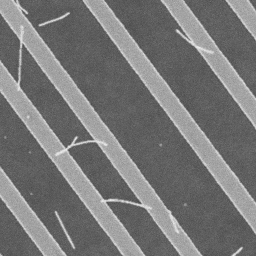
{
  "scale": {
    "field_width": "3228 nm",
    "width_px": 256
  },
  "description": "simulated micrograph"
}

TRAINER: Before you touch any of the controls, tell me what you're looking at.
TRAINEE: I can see lines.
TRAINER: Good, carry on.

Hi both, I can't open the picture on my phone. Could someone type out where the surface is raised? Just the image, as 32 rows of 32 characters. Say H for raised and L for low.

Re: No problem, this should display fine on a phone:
HHLLLLLLLLLHHLLLLLLLLHHLLLLLLHHL
HHHLLLLLLLLHHHLLLLLLLHHHLLLLLHHH
LHHLLLLLLLLLHHHLLLLLLLHHHLLLLLHH
LHHHLLLLLLLLLHHHLLLLLLLHHLLLLLLH
LLHHHLLLLLLLLLHHLLLLLLLHHHLLLLLL
LLLHHHLLLLLLLLHHHLLLLLLLHHHLLLLL
LLLLHHLLLLLLLLLHHHLLLLLLLHHHLLLL
LLLLHHHLLLLLLLLLHHHLLLLLLLHHLLLL
HLLLLHHHLLLLLLLLLHHLLLLLLLHHHLLL
HLLLLLHHHLLLLLLLLHHHLLLLLLLHHHLL
HHLLLLLHHLLLLLLLLLHHHLLLLLLLHHHL
HHHLLLLHHHLLLLLLLLLHHHLLLLLLLHHL
LHHHLLLLHHHLLLLLLLLLHHLLLLLLLHHH
LLHHLLLLLHHHLLLLLLLLHHHLLLLLLLHH
LLHHHLLLLLHHLLLLLLLLLHHHLLLLLLLH
LLLHHHLLLLHHHLLLLLLLLLHHHLLLLLLL
LLLLHHHLLLLHHHLLLLLLLLLHHLLLLLLL
LLLLLHHLLLLLHHHLLLLLLLLHHHLLLLLL
LLLLLHHHLLLLLHHLLLLLLLLLHHHLLLLL
LLLLLLHHHLLLLHHHLLLLLLLLLHHHLLLL
LLLLLLLHHHLLLLHHHLLLLLLLLLHHLLLL
HLLLLLLLHHLLLLLHHHLLLLLLLLHHHLLL
HLLLLLLLHHHLLLLLHHLLLLLLLLLHHHLL
HHLLLLLLLHHHLLLLHHHLLLLLLLLLHHHL
HHHLLLLLLLHHHLLLLHHHLLLLLLLLLHHL
LHHLLLLLLLLHHHLLLLHHLLLLLLLLLHHH
LHHHLLLLLLLHHHLLLLLHHLLLLLLLLLHH
LLHHHLLLLLLLHHHLLLLHHHLLLLLLLLLH
LLLHHHLLLLLLLHHHLLLLHHHLLLLLLLLH
LLLLHHLLLLLLLLHHLLLLLHHLLLLLLLLL
LLLLHHHLLLLLLLHHHLLLLLHHLLLLLLLL
LLLLLHHHLLLLLLLHHHLLLLHHHLLLLLLL